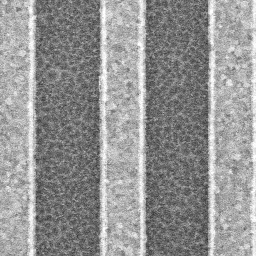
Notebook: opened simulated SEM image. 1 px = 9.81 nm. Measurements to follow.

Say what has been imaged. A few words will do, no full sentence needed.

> one or a few lines or trenches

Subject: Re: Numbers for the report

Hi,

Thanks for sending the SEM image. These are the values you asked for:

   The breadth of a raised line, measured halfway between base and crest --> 38.8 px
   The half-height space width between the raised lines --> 711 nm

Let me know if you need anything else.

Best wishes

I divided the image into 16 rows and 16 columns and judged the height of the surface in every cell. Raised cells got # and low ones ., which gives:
##.....##....###
##....###....###
##....###....###
##.....##....###
##.....##....###
##.....##....###
##.....##....###
##.....##....###
##.....##....###
##.....##....###
##.....##....###
##....###....###
##.....##....###
##.....##....###
##.....##....###
##.....##....###